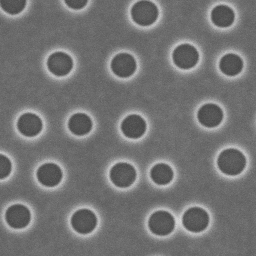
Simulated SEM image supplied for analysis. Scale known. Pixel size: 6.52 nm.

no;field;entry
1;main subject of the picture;a regular array of holes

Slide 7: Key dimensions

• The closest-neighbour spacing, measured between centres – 0.329 micrometres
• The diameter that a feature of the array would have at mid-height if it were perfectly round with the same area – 169 nanometres